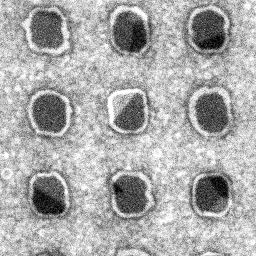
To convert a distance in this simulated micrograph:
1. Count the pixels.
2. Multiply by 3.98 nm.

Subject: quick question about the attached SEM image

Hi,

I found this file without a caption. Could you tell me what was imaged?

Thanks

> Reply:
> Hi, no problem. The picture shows a regular array of raised bodies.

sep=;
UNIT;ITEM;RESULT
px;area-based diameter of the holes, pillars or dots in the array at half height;45.1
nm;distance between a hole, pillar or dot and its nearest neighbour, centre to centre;321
